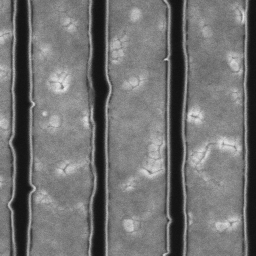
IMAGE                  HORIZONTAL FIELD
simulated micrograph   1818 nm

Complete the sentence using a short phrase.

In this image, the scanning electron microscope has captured one or a few lines or trenches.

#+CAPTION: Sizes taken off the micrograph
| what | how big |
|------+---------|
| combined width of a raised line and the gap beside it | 549 nm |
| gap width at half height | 0.427 microns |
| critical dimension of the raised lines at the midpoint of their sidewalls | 0.129 microns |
